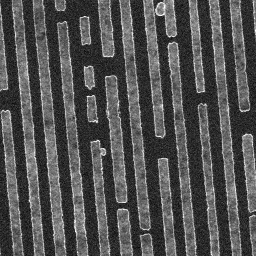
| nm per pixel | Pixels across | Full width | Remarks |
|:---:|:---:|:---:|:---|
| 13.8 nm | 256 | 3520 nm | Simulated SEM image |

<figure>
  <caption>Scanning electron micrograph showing parallel lines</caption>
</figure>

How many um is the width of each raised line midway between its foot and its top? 0.132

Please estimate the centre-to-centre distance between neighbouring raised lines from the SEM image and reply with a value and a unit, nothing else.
299 nm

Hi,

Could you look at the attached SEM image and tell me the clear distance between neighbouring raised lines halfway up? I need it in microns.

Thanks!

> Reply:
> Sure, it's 0.164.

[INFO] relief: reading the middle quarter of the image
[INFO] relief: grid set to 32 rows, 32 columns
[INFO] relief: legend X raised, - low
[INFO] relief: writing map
XX-------------XXX---XXX--XXX---
XX---XX---------XX---XXX---XX---
XX---XX---------XX----XX---XX---
XX---XX---XXX---XX----XX---XX---
XX---XX---XXX---XX----XX---XX---
XX----X----XX---XX----XX---XX---
XX---------XX---XX----XX---XX---
XX---------XX---XX----XX---XX---
XX----XX---XX---XXX---XX---XX---
XX----XX---XXX--XXX---XXX--XX---
XX----XX---XX---XXX---XXX--XX---
XX----XX---XX---XXX---XXX---XX--
XXX---XX---XXX---XX----XX---XX--
-XX---XX---XXX---XX----XX---XX--
-XX--------XXX---XX----XX---XX--
-XX--------XXX---XX----XX---XX--
-XX---------XX---XX----XX---XX--
-XX---------XX---XX----XX---XX--
-XX---------XX---XX---------XX--
-XX----XX---XX---XXX--------XX--
-XX----XX---XXX--XXX--------XX--
-XX----XXX--XXX--XXX--------XXX-
-XXX---XXX--XXX--XXX---------XX-
-XXX---XX---XXX--XXX---------XX-
--XX---XX---XXX---XX----XX---XX-
--XX---XX---XXX---XX----XX---XX-
--XX---XX---XXX---XX----XX---XX-
--XX---XXX---XX---XX----XX---XX-
--XX---XXX---XX---XX----XX---XX-
--XX----XX---XX---XX----XX---XX-
--XX----XX---XXX--XXX---XX---XX-
--XX----XX---XXX--XXX---XX---XXX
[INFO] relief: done